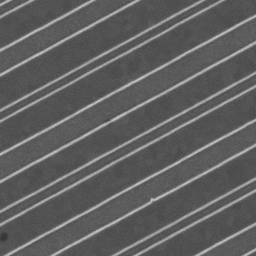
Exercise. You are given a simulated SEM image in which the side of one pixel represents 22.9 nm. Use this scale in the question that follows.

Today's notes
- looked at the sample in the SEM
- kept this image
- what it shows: parallel lines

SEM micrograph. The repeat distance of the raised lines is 1040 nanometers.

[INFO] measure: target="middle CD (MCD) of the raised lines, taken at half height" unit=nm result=661